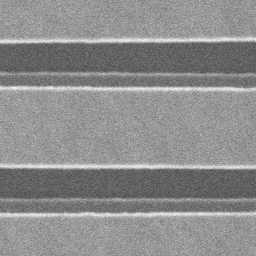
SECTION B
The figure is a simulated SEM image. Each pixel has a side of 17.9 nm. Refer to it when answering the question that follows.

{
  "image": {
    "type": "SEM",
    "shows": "lines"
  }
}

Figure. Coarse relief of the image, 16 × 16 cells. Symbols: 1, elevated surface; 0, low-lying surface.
1111111111111111
1111111111111111
1111111111111100
0000000000000000
0000000000000000
1111110000000000
1111111111111111
1111111111111111
1111111111111111
1111111111111111
0000000000000000
0000000000000000
0000000000000000
1111111111111111
1111111111111111
1111111111111111